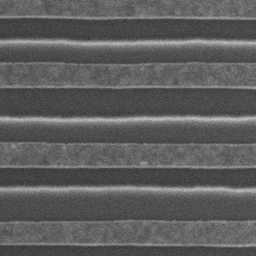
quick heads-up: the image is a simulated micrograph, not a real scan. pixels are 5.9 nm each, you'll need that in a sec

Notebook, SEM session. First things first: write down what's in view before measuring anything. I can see lines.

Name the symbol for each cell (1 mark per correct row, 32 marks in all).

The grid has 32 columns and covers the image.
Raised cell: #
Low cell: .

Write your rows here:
################################
################################
................................
................................
................................
################################
################################
################################
################################
################################
################################
................................
................................
................................
................................
################################
################################
################################
################################
################################
################################
................................
................................
................#...............
################################
################################
################################
################################
################################
################################
##....##########################
................................